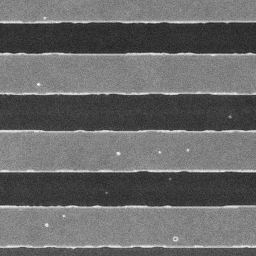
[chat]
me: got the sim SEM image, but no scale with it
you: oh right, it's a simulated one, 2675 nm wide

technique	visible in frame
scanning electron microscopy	lines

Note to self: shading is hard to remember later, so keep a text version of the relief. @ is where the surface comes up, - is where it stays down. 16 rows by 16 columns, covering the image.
@@@@@@@@@@@@@@@@
----------------
----------------
@@@@@@@@@@@@@@@@
@@@@@@@@@@@@@@@@
@@@@@@@@@@@@@@@@
----------------
----------------
@@@@@@@@@@@@@@@@
@@@@@@@@@@@@@@@@
@@@@@@@@@@@@@@@@
----------------
----------------
@@@@@@@@@@@@@@@@
@@@@@@@@@@@@@@@@
----------------